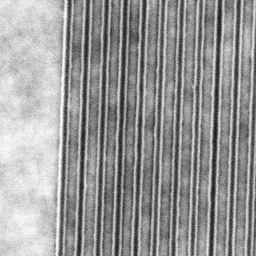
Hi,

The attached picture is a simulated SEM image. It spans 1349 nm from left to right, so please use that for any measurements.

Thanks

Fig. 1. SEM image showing parallel lines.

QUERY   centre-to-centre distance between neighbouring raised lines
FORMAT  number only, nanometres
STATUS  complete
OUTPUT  99.3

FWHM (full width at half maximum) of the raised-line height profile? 40.2 nanometres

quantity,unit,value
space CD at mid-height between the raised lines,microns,0.0599